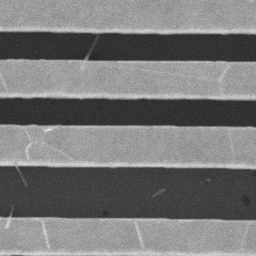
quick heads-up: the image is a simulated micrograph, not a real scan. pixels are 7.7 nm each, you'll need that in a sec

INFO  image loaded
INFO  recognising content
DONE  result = lines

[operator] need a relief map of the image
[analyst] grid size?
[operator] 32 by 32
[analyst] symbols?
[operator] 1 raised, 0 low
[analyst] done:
11111111111111111111111111111111
11111111111111111111111111111111
11111111111111111111111111111111
11111111111111111111111111111111
00000000000000000000000000000000
00000000000000000000000000000000
00000000000000000000000000000000
01100100001000000000000000000000
11111111111111111111111111111111
11111111111111111111111111111111
11111111111111111111111111111111
11111111111111111111111111111111
00000000000000000000000000000000
00000000000000000000000000000000
00000000000000000000000000000000
00000000000000000000000000000000
11111111111111111111111111111111
11111111111111111111111111111111
11111111111111111111111111111111
11111111111111111111111111111111
11111111111111111111111111111111
00000000000000000000000000000000
00000000000000000000000000000000
00000000000000000000000000000000
00000000000000000000000000000000
00000000000000000000000000000000
00000000000000000000000000000000
11111111111111111111111111110000
11111111111111111111111111111111
11111111111111111111111111111111
11111111111111111111111111111111
11111111111111111111111111111111